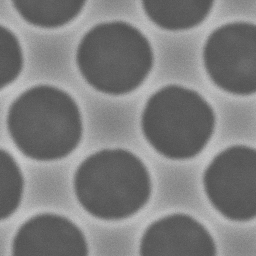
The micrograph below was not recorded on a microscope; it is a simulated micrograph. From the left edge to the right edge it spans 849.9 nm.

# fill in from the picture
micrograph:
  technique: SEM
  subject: holes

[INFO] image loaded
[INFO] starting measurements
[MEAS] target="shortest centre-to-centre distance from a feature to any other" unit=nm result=298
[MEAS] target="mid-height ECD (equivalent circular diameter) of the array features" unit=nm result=250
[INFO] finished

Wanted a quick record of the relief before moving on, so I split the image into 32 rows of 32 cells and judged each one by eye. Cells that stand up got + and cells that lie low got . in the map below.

++.........+++++++.........+++++
++........++++++++........++++++
+++......++++++++++.......++++++
.++++..+++++.....+++....+++.....
..++++++++........++++++++......
..++++++++.........+++++++......
...+++++++.........++++++.......
...+++++++.........++++++.......
...+++++++.........+++++++......
..++++++++........++++++++......
.++++++++++.......+++++++++.....
+++.....+++++...+++......+++....
++.......+++++++++........++++++
+.........++++++++.........+++++
+.........++++++++.........+++++
+.........++++++++.........+++++
+.........++++++++.........+++++
+.........++++++++........++++++
++........+++++++++.......++...+
..+.....+++......+++.....++.....
..++++++++........++++++++......
...++++++..........+++++++......
...++++++..........++++++.......
...++++++..........+++++++......
...+++++++.........+++++++......
..++++++++........++++++++......
..+++++++++......++++++++++.....
+++......++++..+++++....++++....
++........++++++++........++++++
++.........+++++++........++++++
++.........+++++++.........+++++
++.........++++++..........+++++